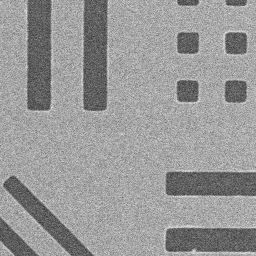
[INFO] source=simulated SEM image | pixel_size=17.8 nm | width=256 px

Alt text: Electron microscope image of groups of lines, slits or small figures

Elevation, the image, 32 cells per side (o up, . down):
ooo....ooo....oooooooo...ooo...o
ooo...oooo....oooooooooooooooooo
ooo...oooo....oooooooooooooooooo
ooo...oooo....oooooooooooooooooo
ooo...oooo....oooooooo...ooo...o
ooo...oooo....oooooooo...ooo...o
ooo....ooo....oooooooo...ooo...o
ooo...oooo....oooooooooooooooooo
ooo...oooo....oooooooooooooooooo
ooo...oooo....oooooooooooooooooo
ooo...oooo....oooooooo...ooo...o
ooo...oooo....oooooooo...ooo...o
ooo...oooo...ooooooooo...ooo...o
ooo...oooo...ooooooooooooooooooo
oooooooooooooooooooooooooooooooo
oooooooooooooooooooooooooooooooo
oooooooooooooooooooooooooooooooo
oooooooooooooooooooooooooooooooo
oooooooooooooooooooooooooooooooo
oooooooooooooooooooooooooooooooo
oooooooooooooooooooooooooooooooo
ooooooooooooooooooooo...........
o.ooooooooooooooooooo...........
o..oooooooooooooooooo...........
o...ooooooooooooooooo...........
oo...ooooooooooooooooooooooooooo
ooo...oooooooooooooooooooooooooo
.ooo...ooooooooooooooooooooooooo
.oooo...ooooooooooooo...........
..oooo...oooooooooooo...........
...oooo...ooooooooooo...........
o...oooo...oooooooooo...........